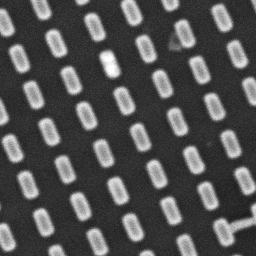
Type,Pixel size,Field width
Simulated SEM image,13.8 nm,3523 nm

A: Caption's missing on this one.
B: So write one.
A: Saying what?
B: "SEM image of a regular array of raised bodies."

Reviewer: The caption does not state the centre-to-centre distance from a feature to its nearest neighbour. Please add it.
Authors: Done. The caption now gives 0.543 µm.